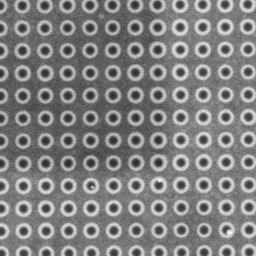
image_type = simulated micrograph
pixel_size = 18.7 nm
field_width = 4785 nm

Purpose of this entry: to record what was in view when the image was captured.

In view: an array of small figures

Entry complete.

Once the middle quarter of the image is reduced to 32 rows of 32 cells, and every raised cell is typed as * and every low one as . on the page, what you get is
**....*....**....**...***...**..
***..***..****..****..***..****.
***..***..****..****..***..****.
**...***...***..***...***...***.
................................
................................
**...***...***..***...***...***.
***..***..****..****..***..****.
***..***..****..****..***..****.
**....**...**....**...***...**..
................................
................................
***..***...***..****..***..****.
***..***...***..****..***..****.
***..***...***..****..***...***.
................................
................................
**....*....**....**...***...**..
***..***..****..****..****.****.
***..****.****..****..****.****.
**...***...***...**...***...***.
................................
................................
**...***...***..****..***...***.
***..***...***..****..****.****.
***..***...***..****..****.****.
**....*.....*....**....**...**..
................................
.......................**...**..
***..***...***..****..****.****.
***..****..***..****..****.****.
***..***...***..****..***...***.